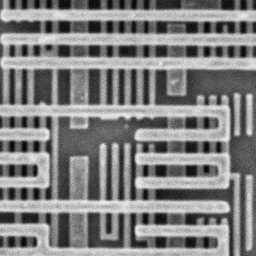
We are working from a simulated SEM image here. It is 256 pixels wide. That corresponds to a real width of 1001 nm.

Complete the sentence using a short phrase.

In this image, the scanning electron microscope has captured wiring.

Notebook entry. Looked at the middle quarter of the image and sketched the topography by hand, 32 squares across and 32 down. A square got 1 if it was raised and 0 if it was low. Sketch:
11111111111111111111111111111111
00000000000000000000000000000000
00000000000000000000000000000000
00000000000000000000000000000000
00000000000000000000000000000000
00000000000000000000000000000000
00000000000000000000000000000000
00000000000000000000000000000000
00000000000000000000000000000000
00000000000000000000000000000000
11111111111111111111111110000000
11111111111111111111111111111111
11111111111111111111111111111111
00000000000000000000000000000000
00000000000000000000000000000000
00000000000000000000000000000000
00000000000000000001111111111111
00000000000000000011111111111111
00000000000000000011111111111111
00000000000000000000000000000000
00000000000000000000000000000000
00000000000000000000000000000000
00000000000000000000110000000000
00000000000000000011111111111111
00000000000000000011111111111111
00000000000000000000000000000000
00000000000000000000000000000000
00000000000000000000000000000000
00000000000000000011111111111111
00000000000000000011111111111111
00000000000000000011111111111111
00000000000000000000000000000000